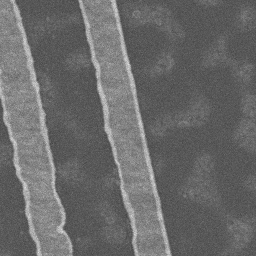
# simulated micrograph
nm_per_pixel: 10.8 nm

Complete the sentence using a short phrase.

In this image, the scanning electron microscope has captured one or a few lines or trenches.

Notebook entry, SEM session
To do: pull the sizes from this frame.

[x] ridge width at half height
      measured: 348 nm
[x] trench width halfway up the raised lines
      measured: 63.6 pixels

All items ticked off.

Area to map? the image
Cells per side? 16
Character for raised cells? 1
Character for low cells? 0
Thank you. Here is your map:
1000011000000000
1000011000000000
1100001100000000
1100001100000000
1100001100000000
1100001100000000
1110000110000000
1110000110000000
0110000110000000
0110000110000000
0110000110000000
0110000011000000
0011000011000000
0011000011000000
0011000011000000
0011000011000000